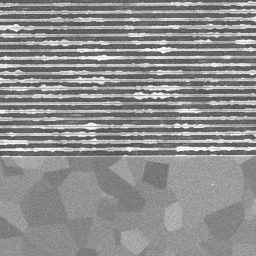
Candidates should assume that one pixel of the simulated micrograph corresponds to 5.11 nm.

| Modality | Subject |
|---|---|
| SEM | parallel lines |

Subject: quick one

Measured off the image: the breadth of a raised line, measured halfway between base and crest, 13.4 nm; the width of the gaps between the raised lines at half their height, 23 nanometers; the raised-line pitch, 0.0389 microns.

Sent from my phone